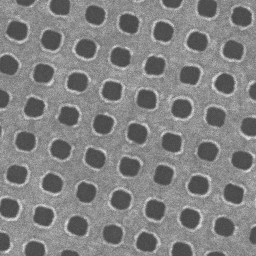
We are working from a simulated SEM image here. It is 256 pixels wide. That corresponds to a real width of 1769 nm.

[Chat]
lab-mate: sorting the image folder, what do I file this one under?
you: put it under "a regular array of holes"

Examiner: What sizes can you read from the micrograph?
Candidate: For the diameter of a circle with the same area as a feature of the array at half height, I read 144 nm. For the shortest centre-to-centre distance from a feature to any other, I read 238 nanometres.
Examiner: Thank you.